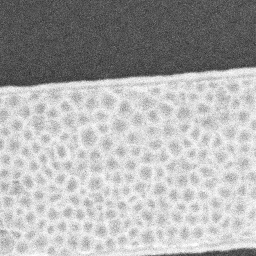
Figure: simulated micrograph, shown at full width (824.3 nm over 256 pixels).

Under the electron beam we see one or a few lines or trenches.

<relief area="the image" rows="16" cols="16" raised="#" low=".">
................
................
................
................
...............#
..##############
################
################
################
################
################
################
################
################
################
##############..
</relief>